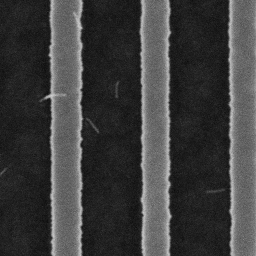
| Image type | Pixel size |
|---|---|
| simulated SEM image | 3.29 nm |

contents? lines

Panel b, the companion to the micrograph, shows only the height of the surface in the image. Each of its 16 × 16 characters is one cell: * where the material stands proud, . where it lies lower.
...**....**...**
...**....**...**
...**....**...**
...**....**...**
...**....**...**
...**....**...**
...**....**...**
...**....**...**
...**....**...**
...**....**...**
...**....**...**
...**....**...**
...**....**...**
...**....**...**
...**....**...**
...**....**...**